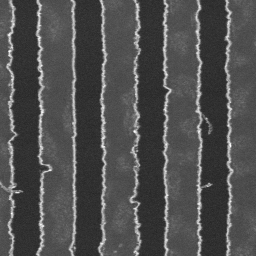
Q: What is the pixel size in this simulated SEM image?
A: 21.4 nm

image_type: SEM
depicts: one or a few lines or trenches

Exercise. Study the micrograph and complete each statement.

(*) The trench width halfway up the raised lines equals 710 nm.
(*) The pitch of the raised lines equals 1340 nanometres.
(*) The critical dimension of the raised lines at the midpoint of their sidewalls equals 630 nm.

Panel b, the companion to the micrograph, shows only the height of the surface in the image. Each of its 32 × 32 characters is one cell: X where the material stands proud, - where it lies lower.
-XXXX----XXXX----XXXX----XXX----
--XXX----XXXX----XXXX----XXXX---
--XXX----XXXX----XXXX----XXXX---
--XXX----XXXX----XXXX----XXXX---
-XXXX----XXXX----XXXX----XXX----
-XXXX----XXXX----XXXX----XXXX---
-XXXX----XXXX----XXX-----XXX----
-XXXX----XXXX----XXXX----XXX----
-XXXX----XXXX----XXXX----XXX----
--XXX----XXXX----XXXX----XXX----
--XXX----XXXX----XXXX----XXX----
--XXX----XXXX----XXXX----XXX----
-XXXX----XXXX----XXXX----XXXX---
-XXXX----XXXX----XXXX----XXXX---
-XXXX----XXXX----XXXX----XXXX---
--XXX----XXXX----XXXX----XXXX---
--XXX----XXXX----XXXX----XXXX---
-XXXX----XXXX----XXXX----XXXX---
-XXXX----XXXX----XXXX----XXXX---
-XXXX----XXXX----XXXX----XXXX---
-XXXXX---XXXX----XXXX----XXXX---
--XXXX---XXXX----XXXX----XXXX---
--XXX----XXXX----XXXX----XXXX---
-XXXX----XXXX----XXXX----XXXX---
-XXXX----XXXX----XXXX----XXXX---
--XXX----XXXX----XXXX----XXXX---
--XXX----XXXX----XXXX----XXXX---
-XXXX----XXXX----XXXX----XXXX---
-XXXX----XXXX----XXXX----XXXX---
-XXXX----XXXX----XXXX----XXX----
--XXX----XXXX----XXXX----XXXX---
-XXXX----XXX-----XXXX----XXX----